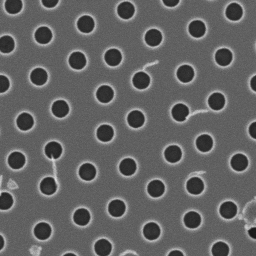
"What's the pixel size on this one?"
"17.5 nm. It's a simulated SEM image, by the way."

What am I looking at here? a regular array of holes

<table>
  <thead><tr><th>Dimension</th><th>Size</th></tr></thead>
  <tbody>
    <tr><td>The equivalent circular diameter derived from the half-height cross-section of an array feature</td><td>317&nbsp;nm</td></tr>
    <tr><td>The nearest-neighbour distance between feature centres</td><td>655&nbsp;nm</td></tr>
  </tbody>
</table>